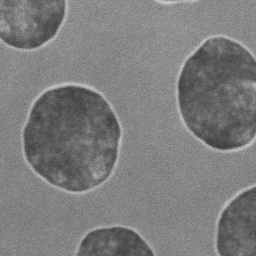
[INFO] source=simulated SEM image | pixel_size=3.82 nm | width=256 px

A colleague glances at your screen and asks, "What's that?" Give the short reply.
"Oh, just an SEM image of holes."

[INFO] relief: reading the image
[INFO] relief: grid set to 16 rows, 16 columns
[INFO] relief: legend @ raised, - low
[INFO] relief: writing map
----@@@@@@@@@@@@
----@@@@@@@@@@@@
---@@@@@@@@@@-@@
@@@@@@@@@@@@----
@@@@@@@@@@@-----
@@@--@@@@@@-----
@@-----@@@@-----
@@-----@@@@-----
@------@@@@@----
@@-----@@@@@@@@@
@@-----@@@@@@@@@
@@@---@@@@@@@@@@
@@@@@@@@@@@@@@@-
@@@@@@@@@@@@@@--
@@@@@@--@@@@@@--
@@@@@----@@@@@--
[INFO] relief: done